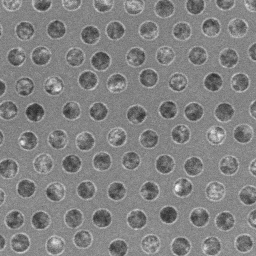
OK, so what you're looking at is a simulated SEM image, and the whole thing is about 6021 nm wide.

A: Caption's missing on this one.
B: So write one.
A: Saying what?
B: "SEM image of a regular array of holes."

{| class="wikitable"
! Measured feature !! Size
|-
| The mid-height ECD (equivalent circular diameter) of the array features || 439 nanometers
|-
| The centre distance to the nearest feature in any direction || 638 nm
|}